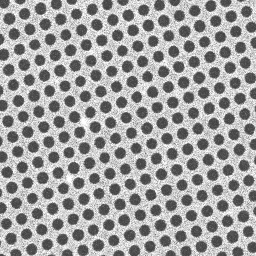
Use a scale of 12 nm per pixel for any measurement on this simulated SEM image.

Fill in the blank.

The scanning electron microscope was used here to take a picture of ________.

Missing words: a regular array of holes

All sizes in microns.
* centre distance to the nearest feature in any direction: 0.192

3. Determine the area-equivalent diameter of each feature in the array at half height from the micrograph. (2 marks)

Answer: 143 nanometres